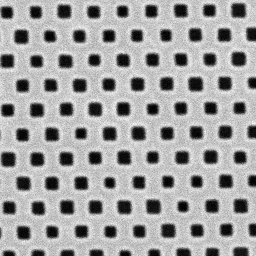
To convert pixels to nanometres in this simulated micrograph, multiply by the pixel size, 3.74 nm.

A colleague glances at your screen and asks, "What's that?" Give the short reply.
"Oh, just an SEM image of a regular array of holes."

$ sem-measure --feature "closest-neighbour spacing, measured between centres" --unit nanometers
105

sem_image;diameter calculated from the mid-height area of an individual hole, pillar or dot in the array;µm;0.0544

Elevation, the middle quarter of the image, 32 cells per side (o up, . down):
..ooooo.ooooo...ooooo..ooooo..oo
oooooooooooooooooooooooooooooooo
oooooooooooooooooooooooooooooooo
oooooooooo..ooooo...oooo...ooooo
oo....ooo....oooo...oooo....ooo.
oo....ooo....oooo...oooo....ooo.
oo....oooo...oooo...oooo...oooo.
oooooooooooooooooooooooooooooooo
oooooooooooooooooooooooooooooooo
oooooooooooooooooooooooooooo..oo
..oooo....ooo....oooo...oooo...o
..oooo....ooo....oooo...oooo...o
..oooo....ooo...ooooo..ooooo...o
oooooooooooooooooooooooooooooooo
oooooooooooooooooooooooooooooooo
oooooooooooooooooooooooooooooooo
ooo...oooo...oooo...oooo...oooo.
ooo...oooo...oooo...oooo...oooo.
ooo...oooo...oooo...oooo...ooooo
oooooooooooooooooooooooooooooooo
oooooooooooooooooooooooooooooooo
oooooooooooooo..oooooooooooooooo
..oooo...oooo....oooo...oooo...o
..oooo....ooo....ooo....oooo...o
..oooo....ooo....oooo..ooooo...o
..oooooooooooooooooooooooooooooo
oooooooooooooooooooooooooooooooo
oooooooooooooooooooooooooooooooo
ooo...oooo..ooooo...oooo...ooooo
oo....oooo...oooo....ooo....oooo
oo....oooo...oooo....oooo..ooooo
oooo.ooooooooooooooooooooooooooo